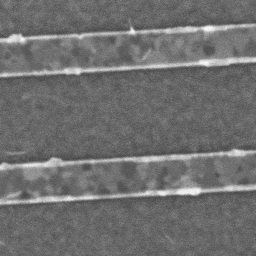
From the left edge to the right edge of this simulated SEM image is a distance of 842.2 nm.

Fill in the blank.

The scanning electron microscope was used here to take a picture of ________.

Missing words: one or a few lines or trenches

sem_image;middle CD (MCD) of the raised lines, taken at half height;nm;121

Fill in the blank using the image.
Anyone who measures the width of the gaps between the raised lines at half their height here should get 296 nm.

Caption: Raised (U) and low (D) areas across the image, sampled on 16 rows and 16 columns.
DDDDDDDDDDDDDDDD
DDDDDDDDDDDDDDDD
UUUUUUUUUUUUUUUU
UUUUUUUUUUUUUUUU
UUUUUDDDDDDDDDDD
DDDDDDDDDDDDDDDD
DDDDDDDDDDDDDDDD
DDDDDDDDDDDDDDDD
DDDDDDDDDDDDDDDD
DDDDDDDDDDDDDDUU
UUUUUUUUUUUUUUUU
UUUUUUUUUUUUUUUU
UUUUDDDDDDDDDDDD
DDDDDDDDDDDDDDDD
DDDDDDDDDDDDDDDD
DDDDDDDDDDDDDDDD